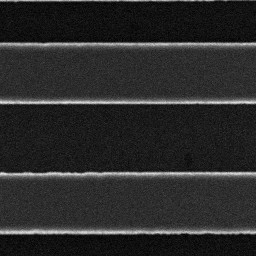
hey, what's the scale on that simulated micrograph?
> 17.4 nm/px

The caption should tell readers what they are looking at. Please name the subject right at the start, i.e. lines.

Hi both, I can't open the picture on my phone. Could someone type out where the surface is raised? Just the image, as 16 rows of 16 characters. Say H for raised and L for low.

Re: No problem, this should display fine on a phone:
LLLLLLLLLLLLLLLL
LLLLLLLLLLLLLLLL
LLLLLLLLLLLLLLLL
HHHHHHHHHHHHHHHH
HHHHHHHHHHHHHHHH
HHHHHHHHHHHHHHHH
LLLLLLLLLLLLLLLL
LLLLLLLLLLLLLLLL
LLLLLLLLLLLLLLLL
LLLLLLLLLLLLLLLL
LLLLLLLLLLLLLLLL
HHHHHHHHHHHHHHHH
HHHHHHHHHHHHHHHH
HHHHHHHHHHHHHHHH
HHHHHHHHHHHHHHHH
LLLLLLLLLLLLLLLL